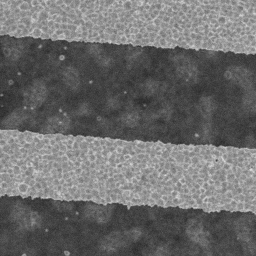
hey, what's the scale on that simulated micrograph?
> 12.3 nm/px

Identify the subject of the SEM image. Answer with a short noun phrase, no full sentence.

one or a few lines or trenches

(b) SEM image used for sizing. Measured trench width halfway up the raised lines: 1.17 microns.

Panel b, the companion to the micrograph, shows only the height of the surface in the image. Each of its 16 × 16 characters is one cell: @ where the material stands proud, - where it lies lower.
@@@@@@@@@@@@@@@@
@@@@@@@@@@@@@@@@
----@@@@@@@@@@@@
----------------
----------------
----------------
----------------
----------------
@@@@@-----------
@@@@@@@@@@@@@@@@
@@@@@@@@@@@@@@@@
@@@@@@@@@@@@@@@@
----@@@@@@@@@@@@
----------------
----------------
----------------